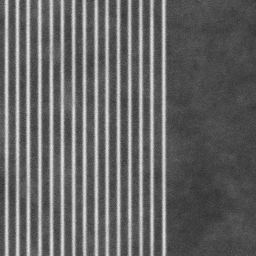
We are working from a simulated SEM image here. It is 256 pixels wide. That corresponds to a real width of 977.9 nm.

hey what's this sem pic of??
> parallel lines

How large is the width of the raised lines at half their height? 6.7 nanometres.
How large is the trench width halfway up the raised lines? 9.4 px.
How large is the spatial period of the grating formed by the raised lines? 43 nanometres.